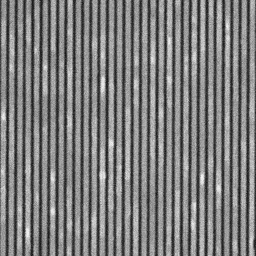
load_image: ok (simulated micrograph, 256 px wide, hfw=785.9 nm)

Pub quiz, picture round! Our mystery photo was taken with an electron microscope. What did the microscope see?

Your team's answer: parallel lines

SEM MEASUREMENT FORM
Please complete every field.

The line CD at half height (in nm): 12.3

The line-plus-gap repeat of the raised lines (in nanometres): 25.4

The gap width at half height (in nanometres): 12.3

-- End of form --